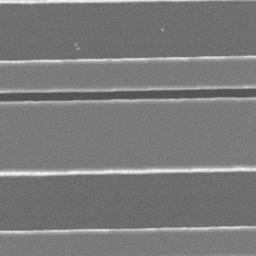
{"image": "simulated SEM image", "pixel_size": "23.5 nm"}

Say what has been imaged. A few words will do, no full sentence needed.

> lines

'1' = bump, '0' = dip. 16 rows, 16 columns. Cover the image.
0000000000000000
0000000000000000
0000000000000000
0000000000000000
1111111111111111
1111111111111111
1111111111111111
1111111111111111
1111111111111111
1111111111111111
1111111111111111
0000000000000000
0000000000000000
0000000000000000
1111111111111111
1111111111111111